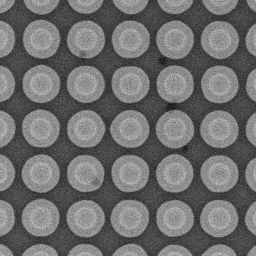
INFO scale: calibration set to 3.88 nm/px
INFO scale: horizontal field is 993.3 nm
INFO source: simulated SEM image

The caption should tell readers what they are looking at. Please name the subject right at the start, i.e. an array of small figures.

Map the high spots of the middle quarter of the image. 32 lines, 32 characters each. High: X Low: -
---------------------------X----
--XXXXXX-----XXXXXXX-----XXXXXX-
-XXXXXXXX---XXXXXXXXX---XXXXXXXX
-XXXXXXXXX--XXXXXXXXX--XXXXXXXXX
-XXXXXXXXX--XXXXXXXXX--XXXXXXXXX
-XXXXXXXXX--XXXXXXXXX--XXXXXXXXX
-XXXXXXXXX--XXXXXXXXX--XXXXXXXXX
--XXXXXXX----XXXXXXXX---XXXXXXXX
--XXXXXXX----XXXXXXX-----XXXXXX-
----XXX--------XXX---------XX---
--------------------------------
--------------------------------
---XXXXX------XXXXX------XXXXX--
--XXXXXXX----XXXXXXX----XXXXXXX-
-XXXXXXXXX--XXXXXXXXX--XXXXXXXXX
-XXXXXXXXX--XXXXXXXXX--XXXXXXXXX
-XXXXXXXXX--XXXXXXXXX--XXXXXXXXX
-XXXXXXXXX--XXXXXXXXX--XXXXXXXXX
-XXXXXXXX---XXXXXXXXX---XXXXXXXX
--XXXXXXX----XXXXXXX----XXXXXXX-
----XXX--------XXXX-------XXXX--
--------------------------------
--------------------------------
---XXXXX------XXXXX------XXXXX--
--XXXXXXX----XXXXXXX----XXXXXXX-
-XXXXXXXXX--XXXXXXXXX--XXXXXXXXX
-XXXXXXXXX--XXXXXXXXX--XXXXXXXXX
-XXXXXXXXX--XXXXXXXXX--XXXXXXXXX
-XXXXXXXXX--XXXXXXXXX--XXXXXXXXX
-XXXXXXXXX--XXXXXXXXX---XXXXXXXX
--XXXXXXX----XXXXXXX----XXXXXXX-
---XXXXX------XXXXX------XXXXX--